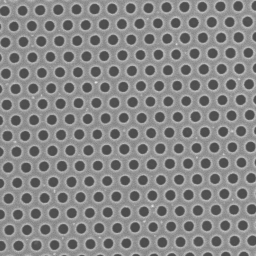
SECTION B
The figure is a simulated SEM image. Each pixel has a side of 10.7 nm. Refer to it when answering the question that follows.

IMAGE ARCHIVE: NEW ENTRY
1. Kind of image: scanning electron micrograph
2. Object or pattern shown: a regular array of holes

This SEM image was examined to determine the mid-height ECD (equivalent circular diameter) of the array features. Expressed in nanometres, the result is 107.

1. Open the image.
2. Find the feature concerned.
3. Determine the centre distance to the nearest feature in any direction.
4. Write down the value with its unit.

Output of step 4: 188 nanometers